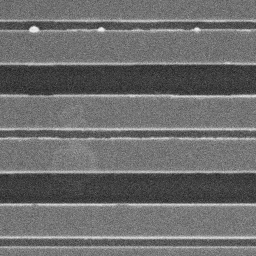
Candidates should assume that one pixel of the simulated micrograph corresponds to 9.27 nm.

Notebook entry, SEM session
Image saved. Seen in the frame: lines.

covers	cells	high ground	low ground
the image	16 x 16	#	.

################
################
################
################
................
................
################
################
################
################
################
................
................
################
################
################